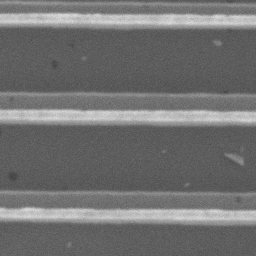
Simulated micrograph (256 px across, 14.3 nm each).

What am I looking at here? lines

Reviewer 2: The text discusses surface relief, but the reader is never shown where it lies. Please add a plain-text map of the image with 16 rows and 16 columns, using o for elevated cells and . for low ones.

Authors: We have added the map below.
oooooooooooooooo
.....ooooooooooo
................
................
................
................
oooooooooooooooo
oooooooooooooooo
................
................
................
................
oooooooooooooooo
oooooooooooooooo
................
................